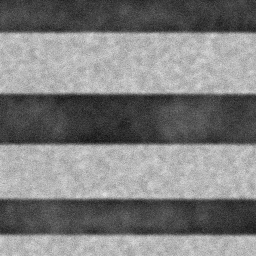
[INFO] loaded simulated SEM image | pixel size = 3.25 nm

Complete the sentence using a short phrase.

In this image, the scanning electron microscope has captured groups of lines, slits or small figures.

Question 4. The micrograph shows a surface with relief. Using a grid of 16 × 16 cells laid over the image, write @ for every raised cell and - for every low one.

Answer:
----------------
----------------
@@@@@@@@@@@@@@@@
@@@@@@@@@@@@@@@@
@@@@@@@@@@@@@@@@
@@@@@@@@@@@@@@@@
----------------
----------------
----------------
@@@@@@@@@@@@@@@@
@@@@@@@@@@@@@@@@
@@@@@@@@@@@@@@@@
----------------
----------------
----------------
@@@@@@@@@@@@@@@@